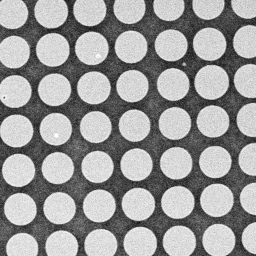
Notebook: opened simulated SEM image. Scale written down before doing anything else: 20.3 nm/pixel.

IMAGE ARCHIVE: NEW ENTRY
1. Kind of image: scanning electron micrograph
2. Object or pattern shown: an array of small figures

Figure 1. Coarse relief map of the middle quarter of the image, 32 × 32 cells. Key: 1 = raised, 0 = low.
00000000000000000000000000000000
00000000000000000000000000111000
00000111100000011111000011111100
00001111111000111111000011111110
10001111111001111111100111111110
11011111111001111111100111111110
11011111111001111111100011111110
10001111111000111111000011111100
10001111111000111111000001111000
00000011100000000000000000000000
00000000000000000000000000000000
00000000000000000000000000111100
00000011110000011111000001111110
10000111111000111111100011111110
10001111111100111111100011111111
11001111111100111111100011111111
11001111111100111111100011111110
11001111111000111111100001111110
10000111111000011111000000111000
00000001100000000000000000000000
00000000000000000000000000000000
00000000000000000111000000111100
00000011111000011111100001111110
10000111111100011111110011111111
11000111111100111111110011111111
11001111111100111111110011111111
11000111111100111111110001111111
11000111111100011111100001111110
10000011111000001111000000011100
00000001000000000000000000000000
00000000000000000000000000000000
00000000000000000111000000111110